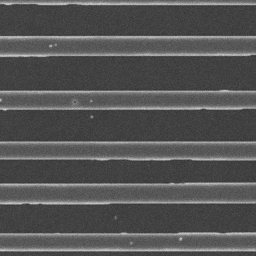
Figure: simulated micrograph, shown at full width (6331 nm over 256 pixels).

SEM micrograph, lines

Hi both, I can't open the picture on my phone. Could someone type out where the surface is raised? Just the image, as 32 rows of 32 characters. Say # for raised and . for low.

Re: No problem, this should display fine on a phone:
#....#.##.######################
................................
................................
................................
................................
################################
################################
................................
................................
................................
................................
################################
################################
################################
................................
................................
................................
................................
################################
################################
................................
................................
................................
################################
################################
................................
................................
................................
................................
################################
################################
................................